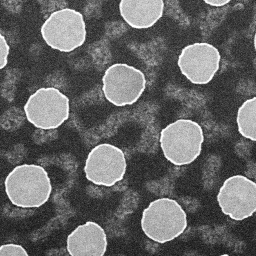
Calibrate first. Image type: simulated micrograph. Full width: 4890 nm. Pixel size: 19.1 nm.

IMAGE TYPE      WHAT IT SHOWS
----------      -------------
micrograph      a regular array of raised bodies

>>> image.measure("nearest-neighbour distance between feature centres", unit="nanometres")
1530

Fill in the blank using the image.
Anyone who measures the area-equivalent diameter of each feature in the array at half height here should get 41.7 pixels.